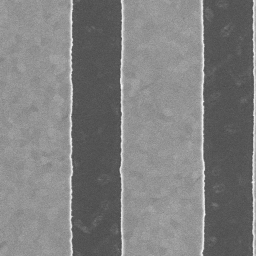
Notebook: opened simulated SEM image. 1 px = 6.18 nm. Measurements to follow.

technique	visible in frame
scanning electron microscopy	one or a few lines or trenches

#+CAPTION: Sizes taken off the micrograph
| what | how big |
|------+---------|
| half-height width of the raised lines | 508 nm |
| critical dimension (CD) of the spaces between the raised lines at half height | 307 nm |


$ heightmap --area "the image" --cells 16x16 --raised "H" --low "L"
HHHHHLLLHHHHHLLL
HHHHHLLLHHHHHLLL
HHHHHLLLHHHHHLLL
HHHHLLLLHHHHHLLL
HHHHLLLLHHHHHLLL
HHHHHLLLHHHHHLLL
HHHHHLLLHHHHHLLL
HHHHLLLLHHHHHLLL
HHHHLLLLHHHHHLLL
HHHHLLLLHHHHHLLL
HHHHHLLLHHHHHLLL
HHHHLLLLHHHHHLLL
HHHHLLLLHHHHHLLL
HHHHLLLLHHHHHLLL
HHHHLLLLHHHHHLLL
HHHHHLLLHHHHHLLL